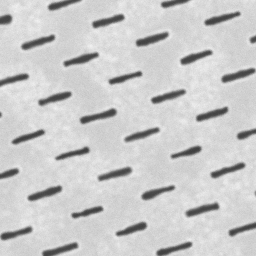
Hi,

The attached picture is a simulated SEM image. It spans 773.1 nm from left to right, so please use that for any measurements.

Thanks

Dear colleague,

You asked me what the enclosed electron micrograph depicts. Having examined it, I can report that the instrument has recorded a regular array of holes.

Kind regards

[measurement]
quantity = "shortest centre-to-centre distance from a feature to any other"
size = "139 nanometers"